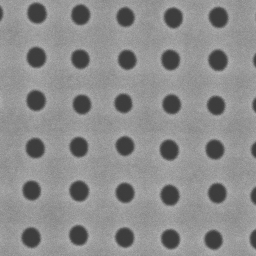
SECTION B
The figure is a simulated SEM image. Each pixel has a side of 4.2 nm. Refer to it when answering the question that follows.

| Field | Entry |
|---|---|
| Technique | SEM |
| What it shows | a regular array of holes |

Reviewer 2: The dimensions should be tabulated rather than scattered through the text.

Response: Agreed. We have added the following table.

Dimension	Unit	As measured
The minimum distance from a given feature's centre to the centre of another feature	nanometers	181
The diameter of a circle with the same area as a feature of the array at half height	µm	0.0858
